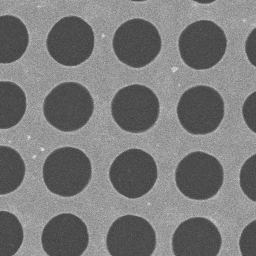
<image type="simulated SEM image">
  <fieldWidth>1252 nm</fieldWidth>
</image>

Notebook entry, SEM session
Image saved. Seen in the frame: a regular array of holes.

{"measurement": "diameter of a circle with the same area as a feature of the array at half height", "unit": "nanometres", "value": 236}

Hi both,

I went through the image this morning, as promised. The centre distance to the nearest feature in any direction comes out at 319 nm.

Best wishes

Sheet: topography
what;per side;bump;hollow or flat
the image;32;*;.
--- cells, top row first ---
********************************
********************************
..******..******..**************
...***.....****....****.....****
....**......**......***.....***.
....**......**......**......***.
...***......**......**......***.
..*****....****....****....****.
************************..******
********************************
..******..**********************
...***.....****....****....*****
...***......**......**......***.
...**.......**......**......**..
...***.....***......**......**..
..****.....****....****....****.
****************.*******..******
********************************
.*******.***********************
...***.....****....****...*****.
...**......***.....***......**..
...**......***......**......**..
...**......***.....***......**..
..****.....***.....***......**..
********.******...*****....****.
********************************
.*******************************
..****....*****...*****...******
...***.....***.....***.....****.
...**......**......***......**..
...**......**......**.......**..
..****....****.....***.....***..